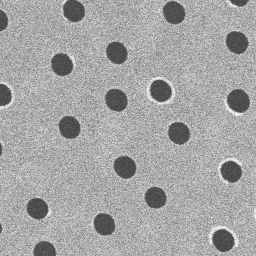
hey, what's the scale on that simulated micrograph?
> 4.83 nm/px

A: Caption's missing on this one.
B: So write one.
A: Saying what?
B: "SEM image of a regular array of holes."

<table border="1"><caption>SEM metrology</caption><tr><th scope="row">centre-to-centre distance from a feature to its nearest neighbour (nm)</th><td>270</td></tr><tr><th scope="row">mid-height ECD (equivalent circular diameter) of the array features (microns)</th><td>0.108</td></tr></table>